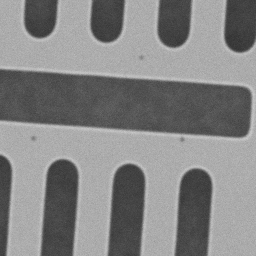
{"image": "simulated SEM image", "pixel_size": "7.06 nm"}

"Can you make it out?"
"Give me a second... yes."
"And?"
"groups of lines, slits or small figures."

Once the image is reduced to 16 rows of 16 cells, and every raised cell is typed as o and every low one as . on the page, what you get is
o...oo..oo..oo..
o..ooo..oo..oo..
oooooo.ooo..oo..
oooooooooooooooo
...ooooooooooooo
...............o
................
................
ooooooooooooo..o
oooooooooooooooo
.oo..oo..ooooooo
.oo..oo..oo..ooo
.oo..oo..oo..ooo
.oo..oo..oo..ooo
.oo..oo..oo..ooo
ooo..oo..oo..ooo